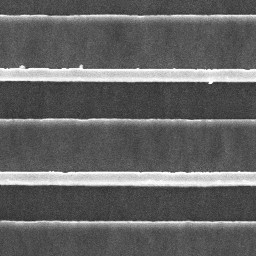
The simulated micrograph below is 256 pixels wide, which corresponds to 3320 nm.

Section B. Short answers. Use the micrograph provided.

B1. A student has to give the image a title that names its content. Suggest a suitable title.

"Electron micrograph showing lines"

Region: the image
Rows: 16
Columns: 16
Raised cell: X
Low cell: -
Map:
----------------
XXXXXXXXXXXXXXXX
XXXXXXXXXXXXXXXX
XXXXXXXXXXXXXXXX
XXXXXXXXXXXXXXXX
----------------
----------------
----------------
XXXXXXXXXXXXXXXX
XXXXXXXXXXXXXXXX
XXXXXXXXXXXXXXXX
--------XXXXXXXX
----------------
----------------
XXXXXXXXXXXXXXXX
XXXXXXXXXXXXXXXX